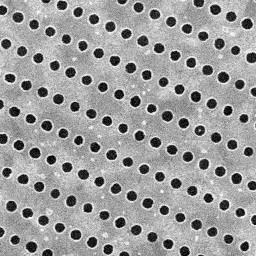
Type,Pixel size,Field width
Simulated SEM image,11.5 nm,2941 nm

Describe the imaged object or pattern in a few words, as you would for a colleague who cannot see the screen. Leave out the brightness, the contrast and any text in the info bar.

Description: a regular array of holes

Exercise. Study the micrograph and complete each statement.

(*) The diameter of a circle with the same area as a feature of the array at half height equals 0.126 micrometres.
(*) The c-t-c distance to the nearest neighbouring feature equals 0.202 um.